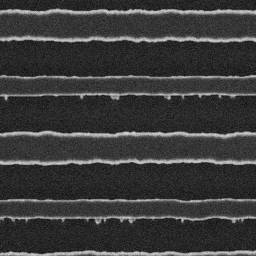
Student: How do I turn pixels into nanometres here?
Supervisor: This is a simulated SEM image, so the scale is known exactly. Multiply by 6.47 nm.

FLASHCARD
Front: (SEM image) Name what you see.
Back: lines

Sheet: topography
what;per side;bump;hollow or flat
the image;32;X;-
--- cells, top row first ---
--------------------------------
XXXXXXXXXXXXXXXXXXXXXXXXXXXXXXXX
XXXXXXXXXXXXXXXXXXXXXXXXXXXXXXXX
XXXXXXXXXXXXXXXXXXXXXXXXXXXXXXXX
XXXXXXXXXXXXXXXXXXXXXXXXXXXXXXXX
--------------------------------
--------------------------------
--------------------------------
--------------------------------
X----X----------X--------------X
XXXXXXXXXXXXXXXXXXXXXXXXXXXXXXXX
XXXXXXXXXXXXXXXXXXXXXXXXXXXXXXXX
--------------------------------
--------------------------------
--------------------------------
--------------------------------
--------------------------------
XXXXXXXXXXXXXXXXXXXXXXXXXXXXXXXX
XXXXXXXXXXXXXXXXXXXXXXXXXXXXXXXX
XXXXXXXXXXXXXXXXXXXXXXXXXXXXXXXX
X---XXXX------------------------
--------------------------------
--------------------------------
--------------------------------
--------------------------------
XXXXXXXXXXXXXXXXXXXXXXXXXXXXXXXX
XXXXXXXXXXXXXXXXXXXXXXXXXXXXXXXX
--------------------------------
--------------------------------
--------------------------------
--------------------------------
----------XX---------X-----XXXXX